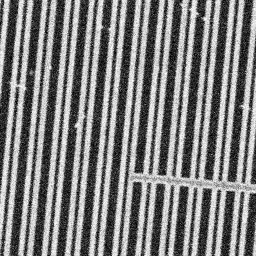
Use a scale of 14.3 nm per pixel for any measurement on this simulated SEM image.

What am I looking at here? parallel lines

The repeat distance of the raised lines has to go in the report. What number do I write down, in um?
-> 0.167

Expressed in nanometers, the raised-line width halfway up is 58.7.